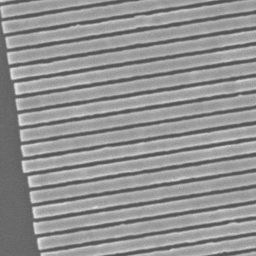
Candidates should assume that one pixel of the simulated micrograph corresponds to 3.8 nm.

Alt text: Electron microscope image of parallel lines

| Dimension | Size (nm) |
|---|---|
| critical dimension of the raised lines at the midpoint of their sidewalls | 42.8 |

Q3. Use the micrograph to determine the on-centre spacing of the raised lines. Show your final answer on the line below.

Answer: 59.2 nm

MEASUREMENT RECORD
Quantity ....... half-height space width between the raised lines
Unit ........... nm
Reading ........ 16.4